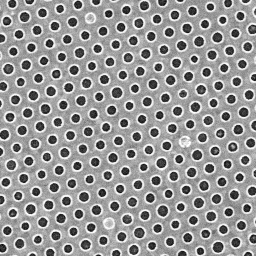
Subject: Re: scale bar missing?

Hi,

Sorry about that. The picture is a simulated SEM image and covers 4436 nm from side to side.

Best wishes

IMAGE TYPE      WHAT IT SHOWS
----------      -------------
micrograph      a regular array of holes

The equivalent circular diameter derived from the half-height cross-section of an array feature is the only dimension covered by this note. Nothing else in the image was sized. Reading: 169 nm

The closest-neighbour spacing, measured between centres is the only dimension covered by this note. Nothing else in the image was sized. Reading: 312 nm